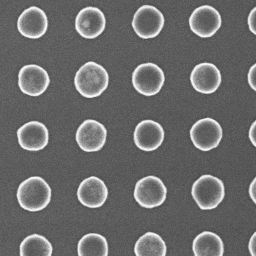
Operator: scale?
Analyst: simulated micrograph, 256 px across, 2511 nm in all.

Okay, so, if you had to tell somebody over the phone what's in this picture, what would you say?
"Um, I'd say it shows a regular array of raised bodies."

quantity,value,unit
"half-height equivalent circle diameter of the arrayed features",297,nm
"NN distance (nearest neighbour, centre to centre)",56.4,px